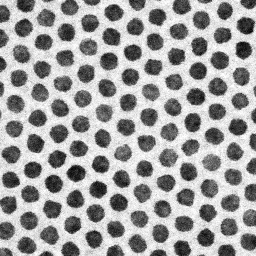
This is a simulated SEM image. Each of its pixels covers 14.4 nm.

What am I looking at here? a regular array of holes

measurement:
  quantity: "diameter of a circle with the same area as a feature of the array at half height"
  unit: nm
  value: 273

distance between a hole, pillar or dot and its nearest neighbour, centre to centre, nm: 355